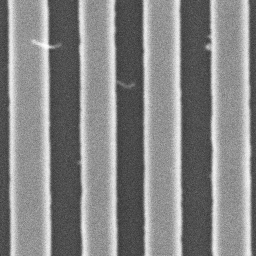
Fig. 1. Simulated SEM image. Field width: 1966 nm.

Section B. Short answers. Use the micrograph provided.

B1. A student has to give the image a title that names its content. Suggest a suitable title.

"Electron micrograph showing lines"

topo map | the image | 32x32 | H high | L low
LHHHHHLLLLHHHHLLLLHHHHLLLLHHHHHL
LHHHHHLLLLHHHHLLLLHHHHLLLLHHHHHL
LHHHHHLLLLHHHHLLLLHHHHLLLLHHHHHL
LHHHHHLLLLHHHHLLLLHHHHLLLLHHHHHL
LHHHHHLLLLHHHHLLLLHHHHLLLLLHHHHL
LHHHHHLLLLHHHHLLLLHHHHLLLLLHHHHL
LHHHHHLLLLHHHHLLLLHHHHLLLLLHHHHL
LHHHHHLLLLHHHHLLLLHHHHLLLLLHHHHL
LHHHHHLLLLHHHHLLLLHHHHLLLLLHHHHL
LHHHHHLLLLHHHHLLLLHHHHLLLLLHHHHL
LHHHHHLLLLHHHHLLLLHHHHLLLLLHHHHL
LHHHHHLLLLHHHHLLLLHHHHHLLLLHHHHL
LHHHHHLLLLHHHHLLLLHHHHLLLLLHHHHL
LHHHHHLLLLHHHHLLLLHHHHHLLLLHHHHL
LHHHHHLLLLHHHHLLLLHHHHHLLLLHHHHL
LHHHHHLLLLHHHHLLLLHHHHHLLLLHHHHL
LHHHHHLLLLHHHHLLLLHHHHHLLLLHHHHL
LHHHHHLLLLHHHHLLLLHHHHHLLLLHHHHL
LHHHHHLLLLHHHHLLLLHHHHHLLLLHHHHL
LHHHHHLLLLHHHHLLLLHHHHHLLLLHHHHL
LHHHHHLLLLHHHHLLLLHHHHHLLLLHHHHL
LHHHHHLLLLHHHHLLLLHHHHHLLLLHHHHL
LHHHHHLLLLHHHHLLLLHHHHHLLLLHHHHL
LHHHHHLLLLHHHHLLLLHHHHHLLLLHHHHL
LHHHHHLLLLHHHHLLLLHHHHHLLLLHHHHL
LHHHHHLLLLHHHHLLLLHHHHHLLLLHHHHL
LHHHHHLLLLHHHHLLLLHHHHHLLLLHHHHL
LHHHHHLLLLHHHHLLLLHHHHHLLLLHHHHL
LHHHHHLLLLHHHHHLLLHHHHHLLLLHHHHL
LHHHHHLLLLHHHHHLLLHHHHHLLLLHHHHL
LHHHHHLLLLHHHHHLLLHHHHHLLLLHHHHL
LHHHHHLLLLHHHHHLLLHHHHHLLLLHHHHL